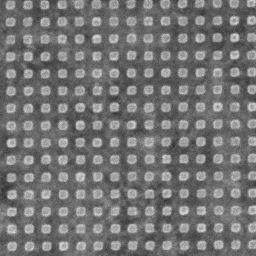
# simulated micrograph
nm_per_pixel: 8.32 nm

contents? a regular array of raised bodies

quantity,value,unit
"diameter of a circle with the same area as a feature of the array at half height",70.9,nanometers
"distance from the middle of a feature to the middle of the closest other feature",0.141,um